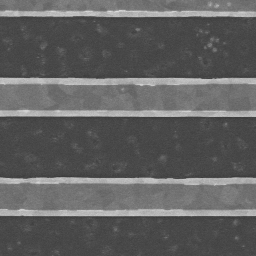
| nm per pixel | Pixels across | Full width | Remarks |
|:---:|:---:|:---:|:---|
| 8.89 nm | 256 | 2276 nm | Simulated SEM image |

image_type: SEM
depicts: one or a few lines or trenches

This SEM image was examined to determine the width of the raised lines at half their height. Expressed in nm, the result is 296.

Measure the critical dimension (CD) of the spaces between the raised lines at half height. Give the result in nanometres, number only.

591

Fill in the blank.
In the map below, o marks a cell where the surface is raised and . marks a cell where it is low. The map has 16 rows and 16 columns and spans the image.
oooooooooooooooo
................
................
................
................
oooooooooooooooo
oooooooooooooooo
................
................
................
................
oooooooooooooooo
oooooooooooooooo
................
................
................